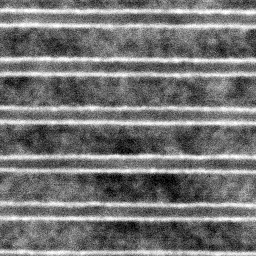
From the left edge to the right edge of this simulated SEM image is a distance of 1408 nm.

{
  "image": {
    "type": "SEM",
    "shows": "lines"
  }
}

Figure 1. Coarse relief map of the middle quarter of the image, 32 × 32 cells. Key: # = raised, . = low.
################################
################################
.###############################
................................
................................
................................
................................
................................
................................
................................
................................
################################
################################
################################
...#############################
................................
................................
................................
................................
................................
................................
................................
................................
################################
################################
################################
################################
................................
................................
................................
................................
................................